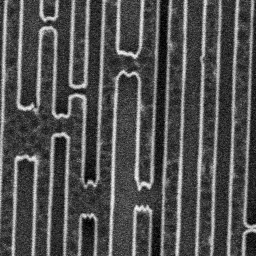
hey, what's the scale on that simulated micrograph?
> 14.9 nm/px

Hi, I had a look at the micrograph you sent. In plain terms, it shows parallel lines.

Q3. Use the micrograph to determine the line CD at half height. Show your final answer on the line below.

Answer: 240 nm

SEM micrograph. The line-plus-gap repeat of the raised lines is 488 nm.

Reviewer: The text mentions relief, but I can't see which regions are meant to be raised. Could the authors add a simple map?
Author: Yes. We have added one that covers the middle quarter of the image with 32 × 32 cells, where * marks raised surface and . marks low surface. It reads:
..***....**************...****..
..***....**************...****..
..***....*****.**.*****...****..
..***....*****.....****...****..
.****....****......****...****..
..***....****......****...****..
.........****......****...****..
.........****......****...****..
.****....****......****...****..
.****....****......****...****..
.****....****......****...****..
.****....****......****...****..
.****....****......***....****..
*****....****......***....****..
*****....****......***...****...
*****....****......***...****...
*****....****......***...****...
*****....****......***....***...
.****....****.....****....***...
.****....****.....****....***...
.****...*****.....****...****...
.****...****......****...****...
.****...****......****...****...
.****...****......****...****...
.****...****......****...****...
.****...****......****...****...
.****...****......****...****...
.****...****......****...****...
.****...****......****...****...
.****.*.****......****...****...
.***********.............****...
.***********.............****...